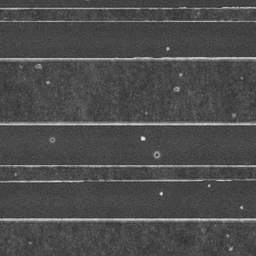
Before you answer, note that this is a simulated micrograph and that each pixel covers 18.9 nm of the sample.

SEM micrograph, lines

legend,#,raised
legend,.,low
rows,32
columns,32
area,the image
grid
................................
################################
################################
................................
................................
................................
................................
################################
################################
################################
################################
################################
################################
################################
################################
################################
................................
................................
................................
................................
................................
################################
##########################.##...
................................
................................
................................
................................
#########################.#..#..
################################
################################
################################
################################